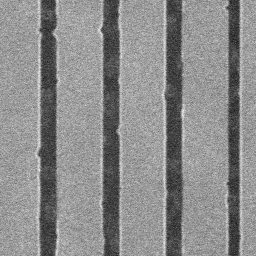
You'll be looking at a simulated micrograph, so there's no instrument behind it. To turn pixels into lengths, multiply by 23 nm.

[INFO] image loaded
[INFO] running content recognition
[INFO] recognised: one or a few lines or trenches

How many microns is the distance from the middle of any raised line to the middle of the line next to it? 1.44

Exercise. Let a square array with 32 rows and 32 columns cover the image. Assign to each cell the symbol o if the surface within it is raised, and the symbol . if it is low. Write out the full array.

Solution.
ooooo..oooooo..oooooo..ooooo..oo
ooooo..oooooo..oooooo..ooooo..oo
ooooo..oooooo..oooooo..ooooo..oo
ooooo..oooooo..oooooo..ooooo..oo
ooooo..oooooo..oooooo..ooooo..oo
ooooo..oooooo..oooooo..ooooo..oo
ooooo..oooooo..oooooo..ooooo..oo
ooooo..oooooo..oooooo..ooooo..oo
ooooo..oooooo..oooooo..ooooo..oo
ooooo..oooooo..oooooo..ooooo..oo
ooooo..oooooo..oooooo..ooooo..oo
ooooo..oooooo..ooooo...ooooo..oo
ooooo..oooooo..ooooo...ooooo..oo
ooooo..oooooo..oooooo..ooooo..oo
ooooo..oooooo..oooooo..ooooo..oo
ooooo..oooooo..oooooo..ooooo..oo
ooooo..oooooo..oooooo..ooooo..oo
ooooo..oooooo..oooooo..ooooo..oo
ooooo..oooooo..oooooo..ooooo..oo
ooooo..oooooo..oooooo..ooooo..oo
ooooo..oooooo..oooooo..ooooo..oo
ooooo..oooooo..oooooo..ooooo..oo
ooooo..oooooo..oooooo..ooooo..oo
ooooo..oooooo..oooooo..ooooo..oo
ooooo..oooooo..oooooo..ooooo..oo
ooooo..oooooo..oooooo..ooooo..oo
ooooo..oooooo..oooooo..ooooo..oo
ooooo..oooooo..oooooo..ooooo..oo
ooooo..oooooo..oooooo..ooooo..oo
ooooo..oooooo..oooooo..ooooo..oo
ooooo..oooooo..oooooo..ooooo..oo
ooooo..oooooo..oooooo..ooooo..oo